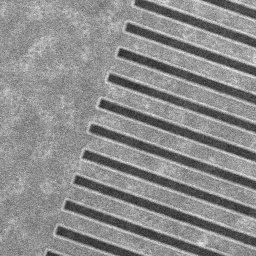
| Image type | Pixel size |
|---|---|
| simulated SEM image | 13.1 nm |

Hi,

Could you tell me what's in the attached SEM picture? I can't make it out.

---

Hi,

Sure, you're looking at parallel lines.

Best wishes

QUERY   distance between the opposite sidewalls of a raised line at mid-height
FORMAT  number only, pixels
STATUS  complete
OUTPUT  15.1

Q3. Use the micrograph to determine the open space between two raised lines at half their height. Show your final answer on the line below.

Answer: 154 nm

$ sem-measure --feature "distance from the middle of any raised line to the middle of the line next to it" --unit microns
0.351